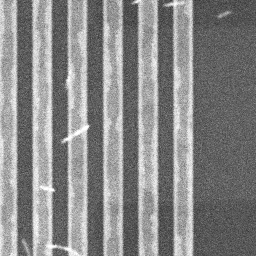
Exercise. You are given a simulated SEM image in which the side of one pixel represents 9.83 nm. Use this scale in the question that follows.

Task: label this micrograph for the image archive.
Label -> parallel lines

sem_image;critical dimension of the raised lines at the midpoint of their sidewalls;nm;154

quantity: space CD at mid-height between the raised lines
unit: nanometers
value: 189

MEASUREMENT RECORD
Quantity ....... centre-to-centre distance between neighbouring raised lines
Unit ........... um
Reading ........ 0.346